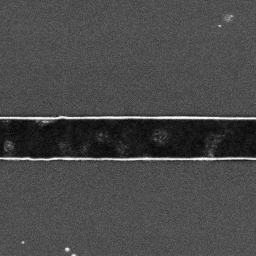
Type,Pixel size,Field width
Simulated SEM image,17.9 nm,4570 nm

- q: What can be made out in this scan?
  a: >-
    one or a few lines or trenches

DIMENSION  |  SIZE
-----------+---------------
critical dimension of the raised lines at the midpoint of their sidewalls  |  0.736 microns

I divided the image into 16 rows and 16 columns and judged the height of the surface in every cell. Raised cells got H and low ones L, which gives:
LLLLLLLLLLLLLLLL
LLLLLLLLLLLLLLLL
LLLLLLLLLLLLLLLL
LLLLLLLLLLLLLLLL
LLLLLLLLLLLLLLLL
LLLLLLLLLLLLLLLL
LLLLLLLLLLLLLLLL
HHHHHHHHHHHHHHHH
HHHHHHHHHHHHHHHH
HHHHHHHHHHHHHHHH
LLLLLLLLLLLLLLLL
LLLLLLLLLLLLLLLL
LLLLLLLLLLLLLLLL
LLLLLLLLLLLLLLLL
LLLLLLLLLLLLLLLL
LLLLLLLLLLLLLLLL